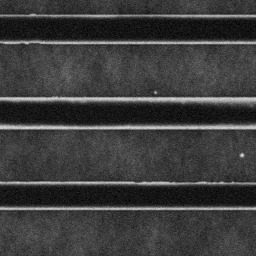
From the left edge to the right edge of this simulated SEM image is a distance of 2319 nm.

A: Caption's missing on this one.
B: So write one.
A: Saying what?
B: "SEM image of lines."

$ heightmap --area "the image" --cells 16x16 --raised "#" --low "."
................
################
################
................
................
................
################
################
................
................
................
################
################
................
................
................